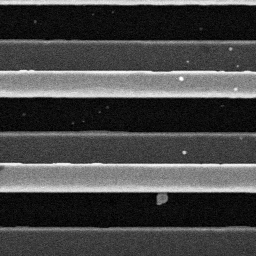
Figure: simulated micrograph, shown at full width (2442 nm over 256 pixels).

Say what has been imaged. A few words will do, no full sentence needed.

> lines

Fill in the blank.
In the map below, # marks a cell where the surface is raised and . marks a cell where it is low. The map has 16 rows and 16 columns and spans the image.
................
................
................
################
################
################
................
................
################
################
################
################
................
................
################
################